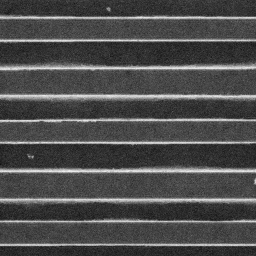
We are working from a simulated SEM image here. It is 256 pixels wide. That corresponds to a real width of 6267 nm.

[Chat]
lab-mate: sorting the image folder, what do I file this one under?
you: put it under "lines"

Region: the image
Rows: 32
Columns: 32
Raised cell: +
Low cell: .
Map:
................................
................................
++++++++++++++++++++++++++++++++
++++++++++++++++++++++++++++++++
++++++++++++++++++++++++++++++++
................................
................................
................................
.............................+++
++++++++++++++++++++++++++++++++
++++++++++++++++++++++++++++++++
++++++++++++++++++++++++++++++++
................................
................................
................................
++++++++++++++++++++++++++++++++
++++++++++++++++++++++++++++++++
++++++++++++++++++++++++++++++++
................................
................................
................................
++++++++++++++++++++++++++++++++
++++++++++++++++++++++++++++++++
++++++++++++++++++++++++++++++++
++++++++++++++++++++++++++++++++
................................
................................
................................
++++++++++++++++++++++++++++++++
++++++++++++++++++++++++++++++++
++++++++++++++++++++++++++++++++
................................